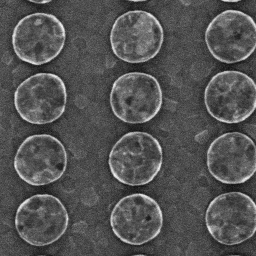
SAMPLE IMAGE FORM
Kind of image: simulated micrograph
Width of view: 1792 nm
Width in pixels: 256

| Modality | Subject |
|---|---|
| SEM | a regular array of raised bodies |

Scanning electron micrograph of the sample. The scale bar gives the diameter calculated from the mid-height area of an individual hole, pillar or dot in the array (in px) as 51.2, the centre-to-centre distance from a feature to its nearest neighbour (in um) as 0.424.